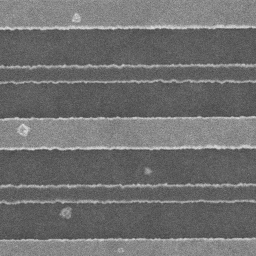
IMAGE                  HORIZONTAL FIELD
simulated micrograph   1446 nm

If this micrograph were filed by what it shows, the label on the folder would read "lines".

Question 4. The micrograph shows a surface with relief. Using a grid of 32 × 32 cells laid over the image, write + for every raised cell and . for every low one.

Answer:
++++++++++++++++++++++++++++++++
++++++++++++++++++++++++++++++++
++++++++++++++++++++++++++++++++
+++++++++++.++++.++.............
................................
................................
................................
................................
+++.++++++++++++++++++++++++++++
++++++++++++++++++++++++++++++++
................................
................................
................................
................................
................................
++++++++++++++++++++++++++++++++
++++++++++++++++++++++++++++++++
++++++++++++++++++++++++++++++++
+++++++++++++++++.++++..+..+.+..
................................
................................
................................
................................
++++++++++++++++++++++++++++++++
++++++++++++++++++++++++++++++++
................................
................................
................................
................................
................................
++++++++++++++++++++++++++++++++
++++++++++++++++++++++++++++++++